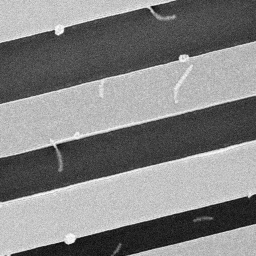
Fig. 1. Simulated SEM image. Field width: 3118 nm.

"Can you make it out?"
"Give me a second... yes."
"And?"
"lines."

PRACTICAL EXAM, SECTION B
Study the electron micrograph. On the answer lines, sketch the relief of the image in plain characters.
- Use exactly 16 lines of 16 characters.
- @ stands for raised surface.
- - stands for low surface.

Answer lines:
@@@@@@@@@-------
@@@@@-----------
@---------------
------------@@@@
--------@@@@@@@@
----@@@@@@@@@@@@
@@@@@@@@@@@@@@--
@@@@@@@@@@------
@@@@@@----------
@@-----------@@@
---------@@@@@@@
-----@@@@@@@@@@@
-@@@@@@@@@@@@@@-
@@@@@@@@@@------
@@@@@@--------@@
@@--------@@@@@@